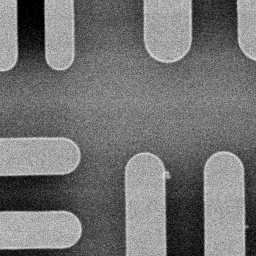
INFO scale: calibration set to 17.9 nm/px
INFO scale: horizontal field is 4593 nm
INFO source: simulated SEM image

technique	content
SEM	groups of lines, slits or small figures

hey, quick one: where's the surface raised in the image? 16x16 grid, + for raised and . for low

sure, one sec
+..++....+++...+
+..++....+++...+
+..++....+++...+
+..++.....+.....
................
................
................
................
................
+++++...........
+++++...++...++.
........++...++.
........++...++.
+++++...++...++.
+++++...++...++.
++......++...++.